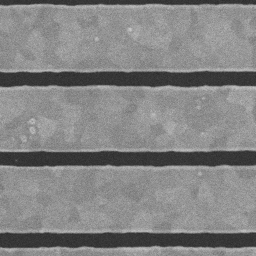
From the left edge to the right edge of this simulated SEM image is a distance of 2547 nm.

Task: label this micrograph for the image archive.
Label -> lines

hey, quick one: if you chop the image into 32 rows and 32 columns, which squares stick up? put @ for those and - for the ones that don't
--------------------------------
@@@@@@@@@@@@@@@@@@@@@@@@@@@@@@@@
@@@@@@@@@@@@@@@@@@@@@@@@@@@@@@@@
@@@@@@@@@@@@@@@@@@@@@@@@@@@@@@@@
@@@@@@@@@@@@@@@@@@@@@@@@@@@@@@@@
@@@@@@@@@@@@@@@@@@@@@@@@@@@@@@@@
@@@@@@@@@@@@@@@@@@@@@@@@@@@@@@@@
@@@@@@@@@@@@@@@@@@@@@@@@@@@@@@@@
@@@@@@@@@@@@@@@@@@@@@@@@@@@@@@@@
--------------------------------
--------------------------------
@@@@@@@@@@@@@@@@@@@@@@@@@@@@@@@@
@@@@@@@@@@@@@@@@@@@@@@@@@@@@@@@@
@@@@@@@@@@@@@@@@@@@@@@@@@@@@@@@@
@@@@@@@@@@@@@@@@@@@@@@@@@@@@@@@@
@@@@@@@@@@@@@@@@@@@@@@@@@@@@@@@@
@@@@@@@@@@@@@@@@@@@@@@@@@@@@@@@@
@@@@@@@@@@@@@@@@@@@@@@@@@@@@@@@@
@@@@@@@@@@@@@@@@@@@@@@@@@@@@@@@@
--------------------------------
--------------------------------
@@@@@@@@@@@@@@@@@@@@@@@@@@@@@@@@
@@@@@@@@@@@@@@@@@@@@@@@@@@@@@@@@
@@@@@@@@@@@@@@@@@@@@@@@@@@@@@@@@
@@@@@@@@@@@@@@@@@@@@@@@@@@@@@@@@
@@@@@@@@@@@@@@@@@@@@@@@@@@@@@@@@
@@@@@@@@@@@@@@@@@@@@@@@@@@@@@@@@
@@@@@@@@@@@@@@@@@@@@@@@@@@@@@@@@
@@@@@@@@@@@@@@@@@@@@@@@@@@@@@@@@
--------------------------------
--------------------------------
@@@@@@@@@@@@@@@@@@@@@@@@@@@@@@@@